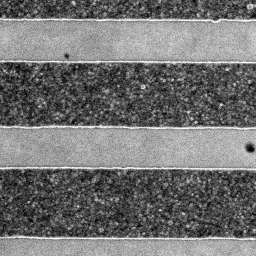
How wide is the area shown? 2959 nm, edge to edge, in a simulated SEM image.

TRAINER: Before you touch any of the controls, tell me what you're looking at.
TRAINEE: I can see one or a few lines or trenches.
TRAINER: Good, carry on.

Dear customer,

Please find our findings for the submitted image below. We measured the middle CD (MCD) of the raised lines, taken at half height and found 765 nanometres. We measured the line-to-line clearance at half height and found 470 nanometers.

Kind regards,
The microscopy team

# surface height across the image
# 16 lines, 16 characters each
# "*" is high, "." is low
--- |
****************
................
................
................
****************
****************
****************
****************
................
................
.*******........
****************
****************
****************
****************
................